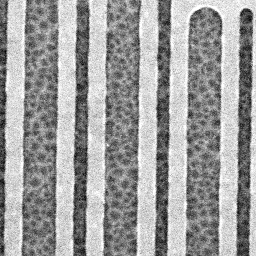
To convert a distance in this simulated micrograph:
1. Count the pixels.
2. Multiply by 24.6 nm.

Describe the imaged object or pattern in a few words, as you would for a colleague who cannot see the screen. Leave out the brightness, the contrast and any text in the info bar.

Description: parallel lines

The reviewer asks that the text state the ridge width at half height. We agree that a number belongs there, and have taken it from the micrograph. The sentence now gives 0.415 microns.